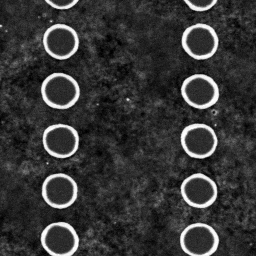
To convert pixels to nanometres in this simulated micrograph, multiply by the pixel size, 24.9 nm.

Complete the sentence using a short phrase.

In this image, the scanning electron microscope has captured a regular array of raised bodies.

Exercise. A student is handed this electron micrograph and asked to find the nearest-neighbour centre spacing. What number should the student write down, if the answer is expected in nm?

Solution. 1240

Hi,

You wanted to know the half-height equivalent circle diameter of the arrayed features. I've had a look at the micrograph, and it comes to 0.822 µm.